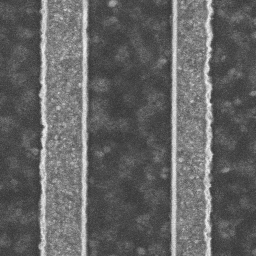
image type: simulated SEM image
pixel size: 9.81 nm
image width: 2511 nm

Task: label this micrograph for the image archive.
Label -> one or a few lines or trenches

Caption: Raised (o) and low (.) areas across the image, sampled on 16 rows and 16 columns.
...oo......oo...
...oo......oo...
...oo......oo...
...oo......oo...
...oo......oo...
...oo......oo...
...oo......oo...
...oo......oo...
...oo......oo...
...oo......oo...
...oo......oo...
...oo......oo...
...oo......oo...
...oo......oo...
...oo......oo...
...oo......oo...